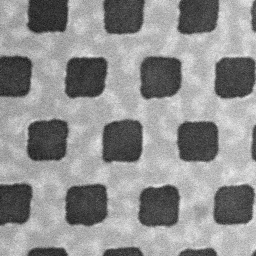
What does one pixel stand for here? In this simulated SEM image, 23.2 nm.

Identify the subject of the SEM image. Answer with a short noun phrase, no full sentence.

a regular array of holes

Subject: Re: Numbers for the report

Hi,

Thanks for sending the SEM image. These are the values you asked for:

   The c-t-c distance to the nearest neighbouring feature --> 1700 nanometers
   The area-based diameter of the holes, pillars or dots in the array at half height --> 1.07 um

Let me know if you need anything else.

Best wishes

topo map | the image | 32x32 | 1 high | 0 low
11100000011110000011110000001110
11100000011110000011110000011110
11100000011110000011110000011110
11100000111110000011110000011110
11111111111111111111111111111111
11111111111111111111111111111111
11111111111111111111111111111111
00001111100001111100001111100000
00001111000000111000000111100000
00001111000001111000000111100000
00001111000001111000000111100000
00001111000001111000001111100000
11111111111111111111111111111111
11111111111111111111111111111111
11111111111111111111111111111111
11110000111110000011111000011111
11100000011110000011110000011110
11100000111110000011110000011110
11100000111110000011110000011110
11110000111110000011110000011110
11111111111111111111111111111111
11111111111111111111111111111111
11111111111111111111111111111111
00001111100001111100001111100000
00001111000001111100000111100000
00001111000000111000000111100000
00001111000000111000001111100000
00011111000001111000001111100000
11111111111111111111111111111111
11111111111111111111111111111111
11111111111111111111111111111111
11110000111110000011111000011111